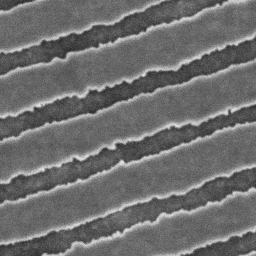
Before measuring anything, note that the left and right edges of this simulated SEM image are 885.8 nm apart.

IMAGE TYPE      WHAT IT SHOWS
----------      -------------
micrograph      one or a few lines or trenches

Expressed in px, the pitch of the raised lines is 60.8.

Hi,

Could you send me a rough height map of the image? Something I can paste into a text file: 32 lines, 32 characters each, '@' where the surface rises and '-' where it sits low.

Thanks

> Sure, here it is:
---@@@@@@@@@@@@@@@@@--------@@@@
@@@@@@@@@@@@@@@@@--------@@@@@@@
@@@@@@@@@@@@@@@-------@@@@@@@@@@
@@@@@@@@@@@--------@@@@@@@@@@@@@
@@@@@@@@--------@@@@@@@@@@@@@@@@
@@@@@--------@@@@@@@@@@@@@@@@@--
@--------@@@@@@@@@@@@@@@@@------
-------@@@@@@@@@@@@@@@@@--------
--@@@@@@@@@@@@@@@@@@@@------@@@@
@@@@@@@@@@@@@@@@@@-------@@@@@@@
@@@@@@@@@@@@@@@--------@@@@@@@@@
@@@@@@@@@@@--------@@@@@@@@@@@@@
@@@@@@@---------@@@@@@@@@@@@@@@@
@@@@---------@@@@@@@@@@@@@@@@@--
@@--------@@@@@@@@@@@@@@@@@-----
------@@@@@@@@@@@@@@@@@@@------@
---@@@@@@@@@@@@@@@@@-------@@@@@
@@@@@@@@@@@@@@@@--------@@@@@@@@
@@@@@@@@@@@@@---------@@@@@@@@@@
@@@@@@@@@@@--------@@@@@@@@@@@@@
@@@@@@@@-------@@@@@@@@@@@@@@@@@
@@@@@--------@@@@@@@@@@@@@@@@---
@----------@@@@@@@@@@@@@@@------
-------@@@@@@@@@@@@@@@@@--------
----@@@@@@@@@@@@@@@@@--------@@@
@@@@@@@@@@@@@@@@@---------@@@@@@
@@@@@@@@@@@@@@--------@@@@@@@@@@
@@@@@@@@@@@--------@@@@@@@@@@@@@
@@@@@@@@@-------@@@@@@@@@@@@@@@@
@@@@@---------@@@@@@@@@@@@@@@---
@--------@@@@@@@@@@@@@@@@@------
--------@@@@@@@@@@@@@@@@--------